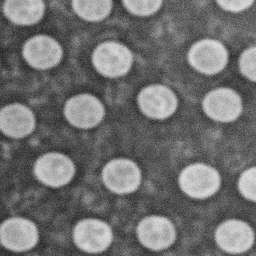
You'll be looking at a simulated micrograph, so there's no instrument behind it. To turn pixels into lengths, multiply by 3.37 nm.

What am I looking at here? a regular array of raised bodies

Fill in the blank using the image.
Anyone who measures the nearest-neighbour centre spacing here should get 216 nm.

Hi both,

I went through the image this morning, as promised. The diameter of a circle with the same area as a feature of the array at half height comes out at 117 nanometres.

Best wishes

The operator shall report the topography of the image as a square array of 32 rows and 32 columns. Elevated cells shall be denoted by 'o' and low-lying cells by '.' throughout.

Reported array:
.oooo....ooooo..oooo........ooo.
.oooo.....oooo...oo.............
..ooo...........................
................................
................................
...oooo......oo..........oo.....
...ooooo....oooo........oooo...o
...oooo.....oooo........oooo..oo
............oooo.........ooo..oo
...............................o
................................
..................ooo......oo...
.........ooo.....ooooo....oooo..
.oo.....ooooo.....oooo....oooo..
oooo....ooooo......oo.....oooo..
oooo.....ooo....................
oooo............................
................................
................................
......oo........................
.....oooo.....ooo...............
....ooooo....oooo......oooo....o
.....oooo....oooo......oooo...oo
..............ooo......oooo...oo
........................oo.....o
................................
................................
.oo...............ooo...........
oooo.....ooooo...ooooo.....oooo.
ooooo....ooooo...ooooo.....ooooo
oooo......oooo....ooo......oooo.
.............................o..